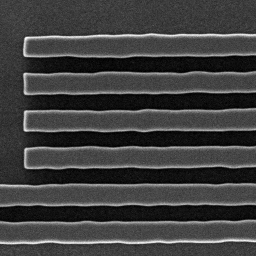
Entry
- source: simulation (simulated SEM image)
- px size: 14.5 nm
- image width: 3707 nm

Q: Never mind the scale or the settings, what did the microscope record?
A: groups of lines, slits or small figures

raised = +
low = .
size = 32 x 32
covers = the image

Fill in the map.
................................
................................
................................
................................
...........+++++++++++++++++++++
...+++++++++++++++++++++++++++++
...+++++++++++++++++++++++++++++
................................
................................
...+++++++++++++++++++++++++++++
...+++++++++++++++++++++++++++++
...+++++++++++++++++++++..+++.+.
................................
................................
...+++++++++++++++++++++++++++++
...+++++++++++++++++++++++++++++
................................
................................
.....+...++++..+++++.+++++++++++
...+++++++++++++++++++++++++++++
...+++++++++++++++++++++++++++++
................................
................................
++++++++++++++++++++++++++++++++
++++++++++++++++++++++++++++++++
++++++++++++++++++++++++++++++++
................................
................................
++++++++++++++++++++++++++++++++
++++++++++++++++++++++++++++++++
................................
................................